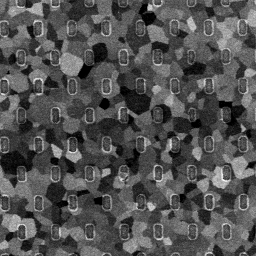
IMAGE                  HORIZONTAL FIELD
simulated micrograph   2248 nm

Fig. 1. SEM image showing a regular array of holes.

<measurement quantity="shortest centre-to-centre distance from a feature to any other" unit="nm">294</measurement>